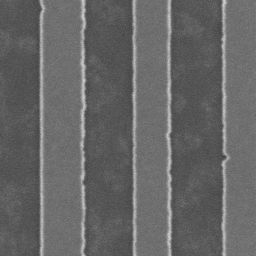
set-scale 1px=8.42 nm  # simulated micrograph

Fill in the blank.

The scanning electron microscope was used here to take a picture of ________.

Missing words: one or a few lines or trenches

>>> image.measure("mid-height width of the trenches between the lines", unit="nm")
440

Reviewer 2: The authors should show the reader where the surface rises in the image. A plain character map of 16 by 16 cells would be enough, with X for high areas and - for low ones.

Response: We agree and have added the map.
---XX---XXX---XX
---XX---XXX---XX
---XX---XXX---XX
---XX---XXX---XX
---XX---XXX---XX
---XX---XXX---XX
---XX---XXX---XX
---XX---XXX---XX
---XX---XXX---XX
---XX---XXX---XX
---XX---XXX---XX
---XX---XXX---XX
---XX---XXX---XX
---XX---XXX---XX
---XX---XXX---XX
---XX---XXX---XX